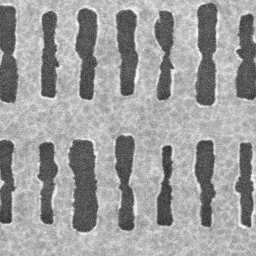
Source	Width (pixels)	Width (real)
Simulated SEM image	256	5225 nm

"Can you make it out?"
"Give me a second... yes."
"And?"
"a regular array of holes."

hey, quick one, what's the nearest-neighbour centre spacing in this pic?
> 0.776 µm